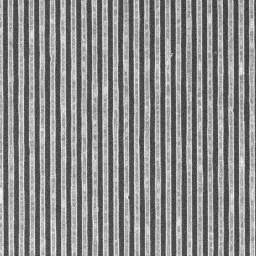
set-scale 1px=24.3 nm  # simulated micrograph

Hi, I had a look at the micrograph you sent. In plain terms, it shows parallel lines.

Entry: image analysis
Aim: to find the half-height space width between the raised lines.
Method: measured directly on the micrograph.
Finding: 149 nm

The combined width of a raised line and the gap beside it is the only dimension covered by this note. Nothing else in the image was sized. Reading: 0.254 microns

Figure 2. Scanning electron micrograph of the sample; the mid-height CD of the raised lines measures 97.1 nm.